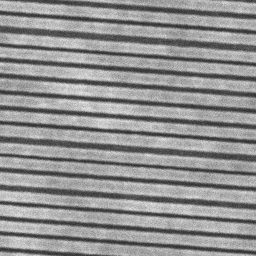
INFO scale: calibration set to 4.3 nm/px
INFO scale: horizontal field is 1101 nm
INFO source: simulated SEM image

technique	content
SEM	parallel lines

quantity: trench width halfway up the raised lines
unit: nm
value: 18.2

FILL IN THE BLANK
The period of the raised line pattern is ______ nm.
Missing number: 67.5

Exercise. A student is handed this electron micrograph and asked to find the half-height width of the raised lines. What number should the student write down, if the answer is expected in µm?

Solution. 0.0471